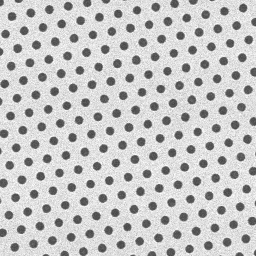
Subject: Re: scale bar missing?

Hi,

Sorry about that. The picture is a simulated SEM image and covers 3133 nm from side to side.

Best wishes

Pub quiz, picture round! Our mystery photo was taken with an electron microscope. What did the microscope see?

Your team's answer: a regular array of holes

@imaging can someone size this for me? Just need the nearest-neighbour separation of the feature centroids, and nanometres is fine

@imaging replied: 229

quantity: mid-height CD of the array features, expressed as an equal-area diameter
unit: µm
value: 0.11